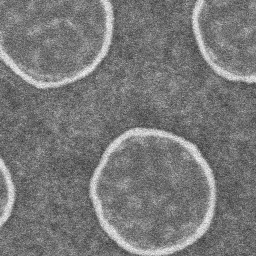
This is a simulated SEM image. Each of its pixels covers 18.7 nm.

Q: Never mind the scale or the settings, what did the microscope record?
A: raised bodies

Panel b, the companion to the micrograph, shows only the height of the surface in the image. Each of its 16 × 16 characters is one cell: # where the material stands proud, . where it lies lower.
#######.....####
#######.....####
#######.....####
######.......###
.####.........##
................
................
................
........###.....
.......#####....
......#######...
#.....#######...
#.....#######...
......#######...
.......######...
........###.....